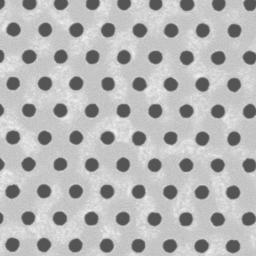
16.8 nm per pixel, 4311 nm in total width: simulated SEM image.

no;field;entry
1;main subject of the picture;a regular array of holes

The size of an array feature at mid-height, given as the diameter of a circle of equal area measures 243 nanometers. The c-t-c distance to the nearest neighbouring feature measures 520 nm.